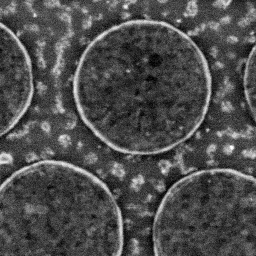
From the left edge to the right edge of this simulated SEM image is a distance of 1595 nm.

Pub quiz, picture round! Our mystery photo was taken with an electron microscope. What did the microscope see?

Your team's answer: raised bodies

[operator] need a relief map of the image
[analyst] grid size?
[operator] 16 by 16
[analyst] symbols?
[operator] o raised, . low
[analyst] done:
................
........oo......
o.....oooooo....
oo...oooooooo...
oo...oooooooo..o
oo...oooooooo..o
oo...oooooooo...
o....oooooooo...
......oooooo....
........oo......
..ooo...........
oooooo.....ooooo
ooooooo...oooooo
ooooooo...oooooo
oooooooo..oooooo
oooooooo..oooooo